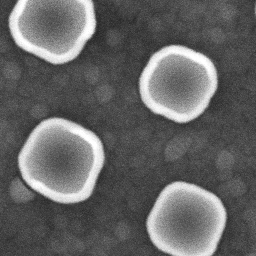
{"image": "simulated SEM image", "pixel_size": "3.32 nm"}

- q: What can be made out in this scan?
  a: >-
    raised bodies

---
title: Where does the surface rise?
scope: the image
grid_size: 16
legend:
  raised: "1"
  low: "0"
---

0111110000000000
0111110000000000
0111100000000000
0001100000111000
0000000001111000
0000000001111000
0000000001111000
0000000000010000
0011110000000000
0111110000000000
0111110000000000
0011110000000000
0000100000111000
0000000001111100
0000000001111100
0000000000111000